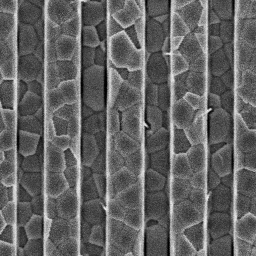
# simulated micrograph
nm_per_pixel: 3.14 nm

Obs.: one or a few lines or trenches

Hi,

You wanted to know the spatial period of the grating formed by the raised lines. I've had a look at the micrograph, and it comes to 199 nm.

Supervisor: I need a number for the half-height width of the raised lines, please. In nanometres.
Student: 114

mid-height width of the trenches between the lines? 83.7 nm